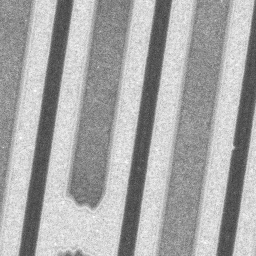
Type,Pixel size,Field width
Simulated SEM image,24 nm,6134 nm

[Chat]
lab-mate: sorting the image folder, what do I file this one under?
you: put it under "parallel lines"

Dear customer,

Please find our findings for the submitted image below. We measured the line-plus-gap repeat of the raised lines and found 1170 nm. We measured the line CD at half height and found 560 nm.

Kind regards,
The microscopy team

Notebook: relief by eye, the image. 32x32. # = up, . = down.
....###..###.....###.###.....###
....###..###....###..###.....###
....###..###....###..###.....###
....###..##.....###..###.....###
....###.###.....###..###....###.
....###.###.....###..##.....###.
...###..###.....###.###.....###.
...###..###.....##..###.....###.
...###..###....###..###.....###.
...###..###....###..###.....###.
...###.###.....###..###.....##..
...##..###.....###..###....###..
...##..###.....###..##.....###..
..###..###.....###.###.....###..
..###..###.....##..###.....###..
..###..###....###..###.....###.#
..###..##.....###..###.....##..#
..###.###.....###..###....###..#
..##..###.....###..###....###..#
.###..###.....###.###.....###..#
.###..###.....###.###.....###..#
.###..###....###..###.....###..#
.###..###....###..###.....###.##
.###..##.....###..###.....##..##
.###.####....###..###....###..##
.##..#####..####..###....###..##
###..###########.###.....###..##
###..##########..###.....###..##
###..##########..###.....###..##
###..##########..###.....##..###
###.###########..###....###..###
##..####..#####..###....###..###